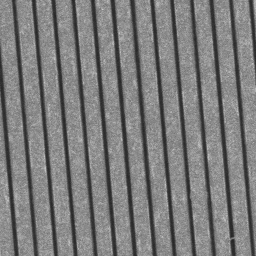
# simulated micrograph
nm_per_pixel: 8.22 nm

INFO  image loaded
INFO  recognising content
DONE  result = parallel lines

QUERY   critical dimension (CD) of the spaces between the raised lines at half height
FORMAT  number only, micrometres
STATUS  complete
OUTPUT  0.0419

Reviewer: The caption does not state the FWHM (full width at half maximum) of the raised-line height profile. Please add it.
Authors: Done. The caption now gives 0.121 micrometres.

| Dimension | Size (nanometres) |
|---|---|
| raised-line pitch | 162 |